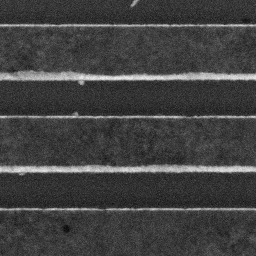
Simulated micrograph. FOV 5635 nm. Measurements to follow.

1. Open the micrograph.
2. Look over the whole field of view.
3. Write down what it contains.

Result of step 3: lines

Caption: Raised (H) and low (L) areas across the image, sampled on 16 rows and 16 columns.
LLLLLLLLLLLLLLLL
LLLLLLLLLLLLLLLL
HHHHHHHHHHHHHHHH
HHHHHHHHHHHHHHHH
HHHHHHHHHHHHHHHH
LLLLLLLLLLLLLLLL
LLLLLLLLLLLLLLLL
HHHHHHHHHHHHHHHH
HHHHHHHHHHHHHHHH
HHHHHHHHHHHHHHHH
HHHHHHHHHHHHHHHH
LLLLLLLLLLLLLLLL
LLLLLLLLLLLLLLLL
HHHHHHHHHHHHHHHH
HHHHHHHHHHHHHHHH
HHHHHHHHHHHHHHHH